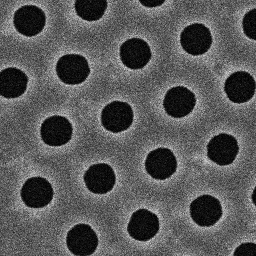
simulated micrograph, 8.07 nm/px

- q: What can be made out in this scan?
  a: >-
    a regular array of holes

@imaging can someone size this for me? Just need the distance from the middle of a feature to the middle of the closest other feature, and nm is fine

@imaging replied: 513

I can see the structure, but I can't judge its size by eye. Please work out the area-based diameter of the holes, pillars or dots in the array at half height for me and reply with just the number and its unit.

0.264 µm